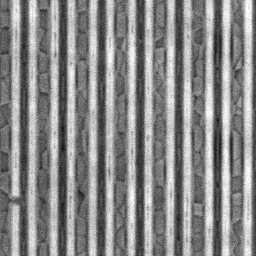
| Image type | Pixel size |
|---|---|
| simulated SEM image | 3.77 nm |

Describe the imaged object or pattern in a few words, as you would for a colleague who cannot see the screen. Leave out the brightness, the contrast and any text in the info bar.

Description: parallel lines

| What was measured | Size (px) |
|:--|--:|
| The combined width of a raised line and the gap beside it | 19.4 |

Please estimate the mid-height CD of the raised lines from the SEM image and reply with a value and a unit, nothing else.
28.7 nm